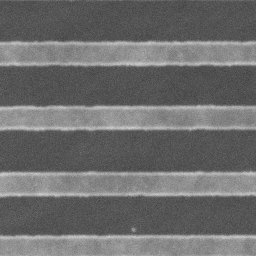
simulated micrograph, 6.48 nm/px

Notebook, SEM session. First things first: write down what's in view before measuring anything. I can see lines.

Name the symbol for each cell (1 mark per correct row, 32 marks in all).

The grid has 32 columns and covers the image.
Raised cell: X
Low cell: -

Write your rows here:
--------------------------------
--------------------------------
--------------------------------
--------------------------------
--------------------------------
XXXXXXXXXXXXXXXXXXXXXXXXXXXXXXXX
XXXXXXXXXXXXXXXXXXXXXXXXXXXXXXXX
XXXXXXXXXXXXXXXXXXXXXXXXXXXXXXXX
--------------------------------
--------------------------------
--------------------------------
--------------------------------
--------------------------------
XXXXXXXXXXXXXXXXXXXXXXXXXXXXXXXX
XXXXXXXXXXXXXXXXXXXXXXXXXXXXXXXX
XXXXXXXXXXXXXXXXXXXXXXXXXXXXXXXX
--------------------------------
--------------------------------
--------------------------------
--------------------------------
--------------------------------
--------------------------------
XXXXXXXXXXXXXXXXXXXXXXXXXXXXXXXX
XXXXXXXXXXXXXXXXXXXXXXXXXXXXXXXX
--------------------------------
--------------------------------
--------------------------------
--------------------------------
--------------------------------
--------------------------------
XXXXXXXXXXXXXXXXXXXXXXXXXXXXXXXX
XXXXXXXXXXXXXXXXXXXXXXXXXXXXXXXX